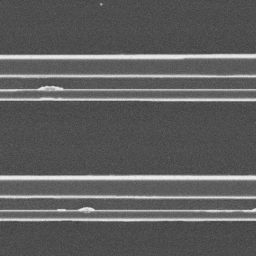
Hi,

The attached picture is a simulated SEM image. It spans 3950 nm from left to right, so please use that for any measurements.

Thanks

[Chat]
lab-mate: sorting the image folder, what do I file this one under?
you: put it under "lines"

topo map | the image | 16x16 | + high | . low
................
................
................
................
++++++++++++++++
++++++++++++++++
................
................
................
................
................
++++++++++++++++
++++++++++++++++
++++++++++++++++
................
................